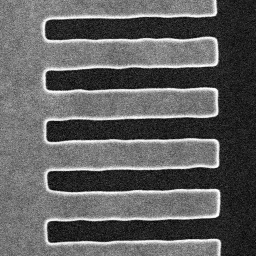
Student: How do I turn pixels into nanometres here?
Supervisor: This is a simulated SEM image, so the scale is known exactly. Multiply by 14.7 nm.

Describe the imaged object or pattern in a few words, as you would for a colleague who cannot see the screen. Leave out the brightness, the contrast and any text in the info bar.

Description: groups of lines, slits or small figures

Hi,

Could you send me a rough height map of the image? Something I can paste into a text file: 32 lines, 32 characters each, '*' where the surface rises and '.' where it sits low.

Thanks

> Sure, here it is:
***************************.....
***************************.....
******..........................
******..........................
******..........................
***************************.....
***************************.....
***************************.....
************..**................
******..........................
******..........................
***************************.....
***************************.....
***************************.....
***************************.....
******..........................
******..........................
******................****......
***************************.....
***************************.....
***************************.....
******..........................
******..........................
******..........................
***************************.....
***************************.....
***************************.....
**********.**...................
******..........................
******..........................
****************************....
****************************....